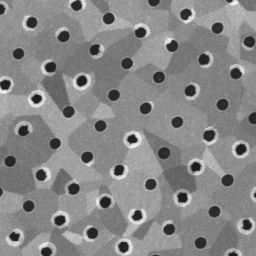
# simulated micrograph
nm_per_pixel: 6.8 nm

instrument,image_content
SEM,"a regular array of holes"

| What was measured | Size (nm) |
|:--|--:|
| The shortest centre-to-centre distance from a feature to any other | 229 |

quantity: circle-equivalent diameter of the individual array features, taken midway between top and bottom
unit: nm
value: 79.4